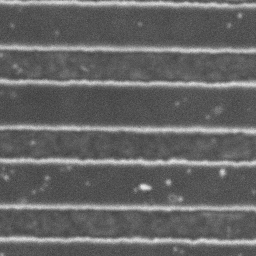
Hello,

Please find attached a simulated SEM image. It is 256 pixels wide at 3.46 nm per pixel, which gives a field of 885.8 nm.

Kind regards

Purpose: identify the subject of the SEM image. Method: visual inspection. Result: lines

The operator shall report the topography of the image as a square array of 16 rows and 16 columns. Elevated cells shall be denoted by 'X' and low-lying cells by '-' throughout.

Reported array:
XXXXXXXXXXXXXXXX
XXXXXXXXXXXXXXXX
XXXXXXXXXXXXXXXX
----------------
----------------
XXXXXXXXXXXXXXXX
XXXXXXXXXXXXXXXX
XXXXXXXXXXXXXXXX
----------------
----------------
XXXXXXXXXXXXXXXX
XXXXXXXXXXXXXXXX
XXXXXXXXXXXXXXXX
----------------
----------------
XXXXXXXXXXXXXXXX